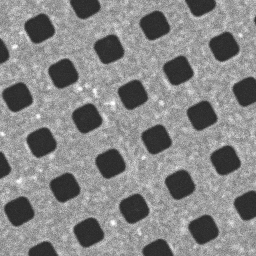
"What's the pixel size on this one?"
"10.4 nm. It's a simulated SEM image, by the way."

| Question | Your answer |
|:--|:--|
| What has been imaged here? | a regular array of holes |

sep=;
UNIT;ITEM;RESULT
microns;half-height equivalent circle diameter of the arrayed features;0.302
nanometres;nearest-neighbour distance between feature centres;528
